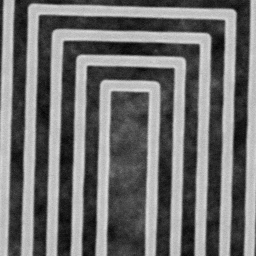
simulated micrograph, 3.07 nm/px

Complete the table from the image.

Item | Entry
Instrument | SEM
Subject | groups of lines, slits or small figures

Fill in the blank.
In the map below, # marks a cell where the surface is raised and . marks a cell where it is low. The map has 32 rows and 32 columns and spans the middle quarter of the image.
...###..........##############..
...##.......................##..
...##.......................##..
...##.......................##..
...##....##############.....##..
...##....###############....##..
...##....###############....##..
...##....##..........###....##..
...##....##..........###....##..
...##....##..........###....##..
...##....##..........###....##..
...##....##..........###....##..
...##....##..........###....##..
...##....##..........###....##..
...##....##..........###....##..
...##....##..........###...###..
...##....##..........###...###..
...##....##..........###...###..
...##....##..........###....##..
...##....##..........###...###..
...##....##..........###...###..
...##....##..........##....###..
..###....##..........##....###..
..###....##..........##....###..
..###....##..........##....##...
..###....##..........##....##...
..###....##..........##....##...
..###....##..........##....##...
..###....##..........##....##...
..###....##..........##....##...
..###....##..........##....##...
..###....##..........##....##...